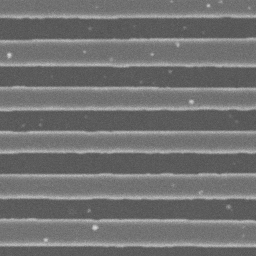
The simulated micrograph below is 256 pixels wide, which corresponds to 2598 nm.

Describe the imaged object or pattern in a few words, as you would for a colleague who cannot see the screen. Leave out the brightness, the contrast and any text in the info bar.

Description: lines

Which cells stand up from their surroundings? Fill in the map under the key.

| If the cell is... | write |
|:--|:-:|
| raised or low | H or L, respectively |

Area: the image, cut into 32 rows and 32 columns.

HHHHHHHHHHHHHHHHHHHHHHHHHHHHHHHH
HHHHHHHHHHHHHHHHHHHHHHHHHHHHHHHH
LLLLLLLLLLLLLLLLLLLLLLLLLLLLLLLL
LLLLLLLLLLLLLLLLLLLLLLLLLLLLLLLL
LLLLLLLLLLLLLLLLLLLLLLLLLLLLLLLL
HHHHHHHHHHHHHHHHHHHHHHHHHHHHHHHH
HHHHHHHHHHHHHHHHHHHHHHHHHHHHHHHH
HHHHHHHHHHHHHHHHHHHHHHHHHHHHHHHH
LLLLLLLLLLLLLLLLLLLLLLLLLLLLLLLL
LLLLLLLLLLLLLLLLLLLLLLLLLLLLLLLL
LLLLLLLLLLLLLLLLLLLLLLLLLLLLLLLL
HHHHHHHHHHHHHHHHHHHHHHHHHHHHHHHH
HHHHHHHHHHHHHHHHHHHHHHHHHHHHHHHH
HHHHHHHHHHHHHHHHHHHHHHHHHHHHHHHH
LLLLLLLLLLLLLLLLLLLLLLLLLLLLLLLL
LLLLLLLLLLLLLLLLLLLLLLLLLLLLLLLL
HHLHHHHHHHHLHHHHHHHHHHHHHHHHHHHH
HHHHHHHHHHHHHHHHHHHHHHHHHHHHHHHH
HHHHHHHHHHHHHHHHHHHHHHHHHHHHHHHH
LLLLLLLLLLLLLLLLLLLLLLLLLLLLLLLL
LLLLLLLLLLLLLLLLLLLLLLLLLLLLLLLL
LLLLLLLLLLLLLLLLLLLLLLLLLLLLLLLL
HHHHHHHHHHHHHHHHHHHHHHHHHHHHHHHH
HHHHHHHHHHHHHHHHHHHHHHHHHHHHHHHH
HHHHHHHHHHHHHHHHHHHHHHHHHHHHHHHH
LLLLLLLLLLLLLLLLLLLLLLLLLLLLLLLL
LLLLLLLLLLLLLLLLLLLLLLLLLLLLLLLL
HHHHHHHHHHHHHHHHHHHHHHHHLLLLLLLL
HHHHHHHHHHHHHHHHHHHHHHHHHHHHHHHH
HHHHHHHHHHHHHHHHHHHHHHHHHHHHHHHH
HHHHHHHHHHHHHHHHHHHHHHHHHHHHHHHH
LLLLLLLLLLLLLLLLLLLLLLLLLLLLLLLL